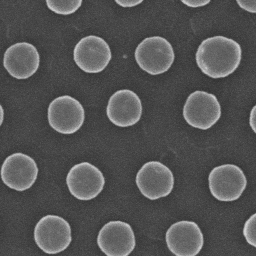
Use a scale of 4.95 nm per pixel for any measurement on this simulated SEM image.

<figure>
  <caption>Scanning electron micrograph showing a regular array of raised bodies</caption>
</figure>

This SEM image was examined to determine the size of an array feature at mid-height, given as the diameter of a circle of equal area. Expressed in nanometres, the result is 179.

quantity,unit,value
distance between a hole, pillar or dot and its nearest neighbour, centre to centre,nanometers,308